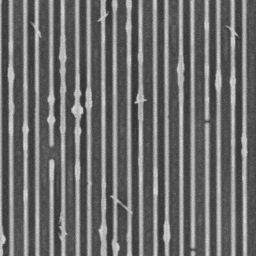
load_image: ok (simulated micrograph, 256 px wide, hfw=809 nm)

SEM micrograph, parallel lines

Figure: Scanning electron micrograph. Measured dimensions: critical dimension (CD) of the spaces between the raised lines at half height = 24.1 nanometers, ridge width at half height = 13.4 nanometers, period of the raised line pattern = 0.041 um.